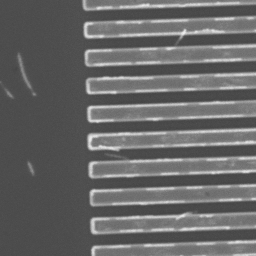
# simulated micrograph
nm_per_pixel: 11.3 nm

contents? parallel lines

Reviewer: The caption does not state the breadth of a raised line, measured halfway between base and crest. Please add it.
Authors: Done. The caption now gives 176 nm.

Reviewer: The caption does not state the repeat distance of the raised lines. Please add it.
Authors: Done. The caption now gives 314 nm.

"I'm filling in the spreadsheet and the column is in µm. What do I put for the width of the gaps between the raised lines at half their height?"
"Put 0.132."